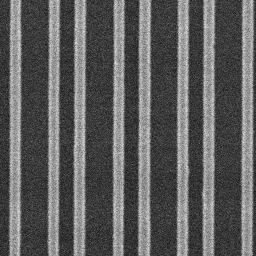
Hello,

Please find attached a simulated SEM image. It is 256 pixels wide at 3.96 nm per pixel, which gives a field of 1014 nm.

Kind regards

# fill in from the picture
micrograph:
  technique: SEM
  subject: parallel lines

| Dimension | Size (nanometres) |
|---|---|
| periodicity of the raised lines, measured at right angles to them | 132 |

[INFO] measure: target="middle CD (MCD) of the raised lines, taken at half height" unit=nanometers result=39.6